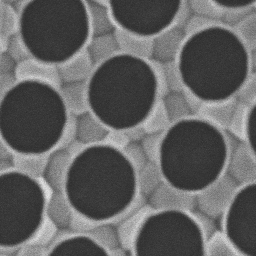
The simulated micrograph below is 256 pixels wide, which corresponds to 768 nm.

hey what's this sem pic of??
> holes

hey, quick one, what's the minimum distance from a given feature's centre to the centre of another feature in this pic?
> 281 nanometres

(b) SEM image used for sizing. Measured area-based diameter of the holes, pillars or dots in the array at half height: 213 nm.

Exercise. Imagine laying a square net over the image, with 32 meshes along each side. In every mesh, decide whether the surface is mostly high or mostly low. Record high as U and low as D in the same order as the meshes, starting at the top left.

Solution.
UUUDDDDDDDUUUUDDDDDDDDDUUUUDDDDU
UUUDDDDDDDDUUUDDDDDDDDUUUUUUUUUU
UUUDDDDDDDDUUUDDDDDDDDUUUUUUUUUU
UUUDDDDDDDDUUUUUDDDDDUUUUUDDUUUU
UUUDDDDDDDDUUUUUUUUUUUUUDDDDDDUU
UUUDDDDDDDUUUUUUUUUUUUUDDDDDDDUU
UUUUDDDDDDUUUUUUUUUUUUUDDDDDDDDU
UUUUUDDDUUUUUDDDDDUUUUDDDDDDDDDU
UUUUUUUUUUUUDDDDDDDUUUDDDDDDDDDU
UUUUUUUUUUUUDDDDDDDUUUUDDDDDDDDU
UUDDDDUUUUUDDDDDDDDDUUUDDDDDDDUU
UDDDDDDUUUUDDDDDDDDUUUUUDDDDDUUU
DDDDDDDDUUUDDDDDDDDUUUUUUUDDUUUU
DDDDDDDDUUUDDDDDDDDUUUUUUUUUUUUU
DDDDDDDDUUUUDDDDDDUUUUUUUUUUUUUD
DDDDDDDDUUUUUDDDDUUUUUDDDDUUUUUD
DDDDDDDDUUUUUUUUUUUUUDDDDDDUUUUD
UDDDDDDUUUUUUUUUUUUUDDDDDDDDUUUD
UDDDDDUUUUUDDDUUUUUUDDDDDDDDUUUU
UUUUUUUUUUDDDDDDUUUUDDDDDDDDUUUU
UUUUUUUUUDDDDDDDUUUUDDDDDDDDUUUU
UUUUUUUUDDDDDDDDDUUUDDDDDDDDUUUU
DDDDUUUUDDDDDDDDDUUUUDDDDDDUUUUU
DDDDDUUUDDDDDDDDDUUUUUDDDDUUUUDD
DDDDDUUUDDDDDDDDDUUUUUUUUUUUUDDD
DDDDDDUUUDDDDDDDUUUUUUUUUUUUUDDD
DDDDDUUUUUDDDDDUUUUUDDDUUUUUUDDD
DDDDDUUUUUUUDUUUUUDDDDDDUUUUDDDD
DDDDDUUUUUUUUUUUUUDDDDDDDUUUDDDD
DDDDUUUUUUUUUUUUUDDDDDDDDUUUUDDD
DDDUUUUDDDDDUUUUUDDDDDDDDUUUUDDD
UUUUUUDDDDDDDUUUUDDDDDDDDUUUUUDD